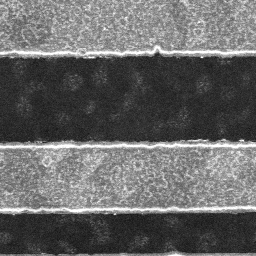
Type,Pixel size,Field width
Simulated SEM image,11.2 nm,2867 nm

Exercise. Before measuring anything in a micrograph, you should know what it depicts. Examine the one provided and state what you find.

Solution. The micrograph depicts one or a few lines or trenches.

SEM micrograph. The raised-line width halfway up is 710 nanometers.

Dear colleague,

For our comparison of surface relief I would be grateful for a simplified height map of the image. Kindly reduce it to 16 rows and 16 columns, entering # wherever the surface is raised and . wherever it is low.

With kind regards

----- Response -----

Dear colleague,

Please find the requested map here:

################
################
################
................
................
................
................
................
................
################
################
################
################
................
................
................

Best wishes